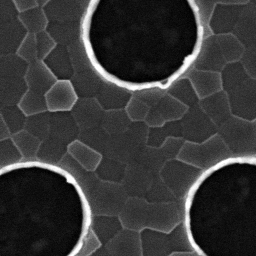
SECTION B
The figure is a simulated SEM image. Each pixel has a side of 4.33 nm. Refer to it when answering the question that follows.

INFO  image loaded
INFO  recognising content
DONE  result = holes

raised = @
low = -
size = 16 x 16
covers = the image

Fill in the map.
@@@@@@------@@@@
@@@@@@------@@@@
@@@@@@------@@@@
@@@@@@------@@@@
@@@@@@@----@@@@@
@@@@@@@@@@@@@@@@
@@@@@@@@@@@@@@@@
@@@@@@@@@@@@@@@@
@@@@@@@@@@@@@@@@
@@@@@@@@@@@@@@@@
@--@@@@@@@@@@@--
----@@@@@@@@----
-----@@@@@@@----
-----@@@@@@@----
-----@@@@@@@----
-----@@@@@@@----